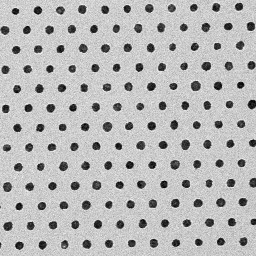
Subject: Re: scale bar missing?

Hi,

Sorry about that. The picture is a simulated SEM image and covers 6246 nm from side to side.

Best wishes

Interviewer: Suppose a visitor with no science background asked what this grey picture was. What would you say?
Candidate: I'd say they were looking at a regular array of holes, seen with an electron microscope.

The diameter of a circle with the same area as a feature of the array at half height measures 0.22 um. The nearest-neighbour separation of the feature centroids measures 535 nm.